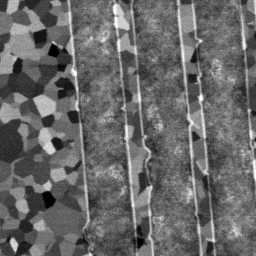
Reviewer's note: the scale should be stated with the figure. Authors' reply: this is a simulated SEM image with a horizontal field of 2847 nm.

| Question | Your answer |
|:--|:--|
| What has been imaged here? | one or a few lines or trenches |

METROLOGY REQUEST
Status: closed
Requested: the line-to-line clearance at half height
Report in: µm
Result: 0.522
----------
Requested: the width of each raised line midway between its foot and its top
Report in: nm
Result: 170